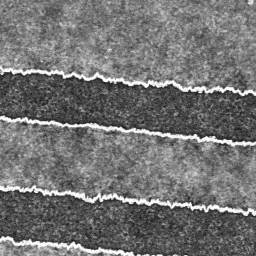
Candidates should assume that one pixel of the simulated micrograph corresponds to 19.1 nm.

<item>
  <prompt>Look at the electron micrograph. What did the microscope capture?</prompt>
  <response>one or a few lines or trenches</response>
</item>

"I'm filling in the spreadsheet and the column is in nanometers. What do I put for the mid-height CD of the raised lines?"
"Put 966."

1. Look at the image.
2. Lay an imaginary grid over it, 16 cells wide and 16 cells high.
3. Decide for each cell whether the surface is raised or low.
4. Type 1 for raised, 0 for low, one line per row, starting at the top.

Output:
0000000000000000
0000000000000000
0000000000000000
0000000000000000
1110000000000000
1111111111100000
1111111111111111
0111111111111111
0000000000011111
0000000000000000
0000000000000000
0000000000000000
1111111100000000
1111111111111111
1111111111111111
0000011111111111